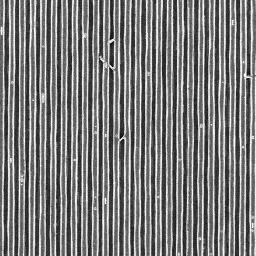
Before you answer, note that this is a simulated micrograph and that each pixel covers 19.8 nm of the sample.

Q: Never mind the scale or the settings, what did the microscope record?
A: parallel lines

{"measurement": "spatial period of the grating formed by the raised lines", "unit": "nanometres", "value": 208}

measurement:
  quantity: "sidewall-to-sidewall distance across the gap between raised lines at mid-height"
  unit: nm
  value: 99.1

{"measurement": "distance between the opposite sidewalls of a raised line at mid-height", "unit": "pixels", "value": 5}